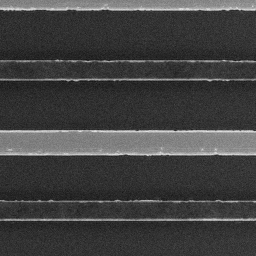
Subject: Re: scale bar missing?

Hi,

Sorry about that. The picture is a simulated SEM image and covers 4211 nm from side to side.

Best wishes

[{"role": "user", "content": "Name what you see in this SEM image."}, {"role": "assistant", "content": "lines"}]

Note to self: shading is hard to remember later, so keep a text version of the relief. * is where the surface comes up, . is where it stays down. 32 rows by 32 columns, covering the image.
********************************
................................
................................
................................
................................
................................
................................
................................
********************************
********************************
................................
................................
................................
................................
................................
................................
********************************
********************************
********************************
................................
................................
................................
................................
................................
................................
********************************
********************************
********************************
................................
................................
................................
................................